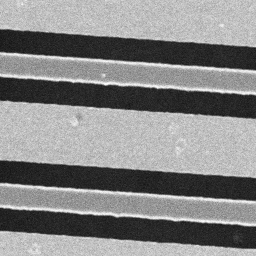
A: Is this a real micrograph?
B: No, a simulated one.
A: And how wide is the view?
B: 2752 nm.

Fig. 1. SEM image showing lines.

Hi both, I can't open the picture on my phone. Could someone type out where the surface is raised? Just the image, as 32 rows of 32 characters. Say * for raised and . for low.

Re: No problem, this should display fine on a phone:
********************************
********************************
********************************
********************************
.............*******************
............................****
................................
*************...................
***************************.....
********************************
............********************
...........................*****
................................
************....................
**************************......
********************************
********************************
********************************
********************************
********************************
........************************
......................**********
................................
********........................
**********************..........
********************************
........************************
.....................***********
................................
*********.......................
***********************.........
********************************